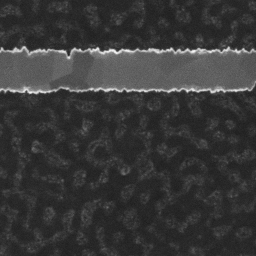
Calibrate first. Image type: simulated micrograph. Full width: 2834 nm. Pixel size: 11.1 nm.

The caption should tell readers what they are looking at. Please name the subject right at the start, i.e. one or a few lines or trenches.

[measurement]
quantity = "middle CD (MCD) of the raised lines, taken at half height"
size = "447 nanometres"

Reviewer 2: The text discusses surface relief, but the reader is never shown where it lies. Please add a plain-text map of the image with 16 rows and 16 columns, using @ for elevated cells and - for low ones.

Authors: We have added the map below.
----------------
----------------
----------------
@@@@@@@@@@@@@@@@
@@@@@@@@@@@@@@@@
@@@@@@@@@@@@@@@@
----------------
----------------
----------------
----------------
----------------
----------------
----------------
----------------
----------------
----------------